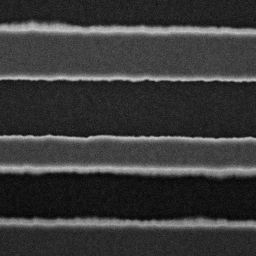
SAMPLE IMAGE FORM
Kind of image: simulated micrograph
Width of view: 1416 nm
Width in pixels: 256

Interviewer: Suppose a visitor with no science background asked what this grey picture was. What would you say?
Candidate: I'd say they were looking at lines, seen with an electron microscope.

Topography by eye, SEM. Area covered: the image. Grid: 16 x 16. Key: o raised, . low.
................
................
oooooooooooooooo
oooooooooooooooo
oooooooooooooooo
................
................
................
................
oooooooooooooooo
oooooooooooooooo
................
................
................
oooooooooooooooo
oooooooooooooooo